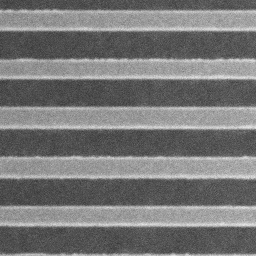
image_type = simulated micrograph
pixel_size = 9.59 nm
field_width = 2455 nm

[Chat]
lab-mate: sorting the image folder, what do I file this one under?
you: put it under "lines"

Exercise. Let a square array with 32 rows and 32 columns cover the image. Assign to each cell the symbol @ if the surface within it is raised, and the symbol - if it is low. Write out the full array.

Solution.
--------------------------------
@@@@@@@@@@@@@@@@@@@@@@@@@@@@@@@@
@@@@@@@@@@@@@@@@@@@@@@@@@@@@@@@@
@@@@@@@@@@@@@@@@@@@@@@@@@@@@@@@@
--------------------------------
--------------------------------
--------------------------------
--@@@--@@@@@@@@@@@@@@@-@@@-@@@@@
@@@@@@@@@@@@@@@@@@@@@@@@@@@@@@@@
@@@@@@@@@@@@@@@@@@@@@@@@@@@@@@@@
--------------------------------
--------------------------------
--------------------------------
@@@@@@@@@@@@@@@@@@@@@@@@@@@@@@@@
@@@@@@@@@@@@@@@@@@@@@@@@@@@@@@@@
@@@@@@@@@@@@@@@@@@@@@@@@@@@@@@@@
--------------------------------
--------------------------------
--------------------------------
--------------------------------
@@@@@@@@@@@@@@@@@@@@@@@@@@@@@@@@
@@@@@@@@@@@@@@@@@@@@@@@@@@@@@@@@
--------------------------------
--------------------------------
--------------------------------
--------------------------------
@@@@@@@@@@@@@@@@@@@@@@@@@@@@@@@@
@@@@@@@@@@@@@@@@@@@@@@@@@@@@@@@@
--------------------------------
--------------------------------
--------------------------------
--------------------------------